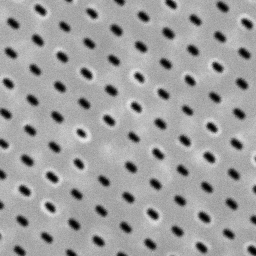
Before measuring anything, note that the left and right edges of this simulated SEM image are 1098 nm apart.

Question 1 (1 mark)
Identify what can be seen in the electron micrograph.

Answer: a regular array of holes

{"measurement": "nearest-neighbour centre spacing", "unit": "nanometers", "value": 127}